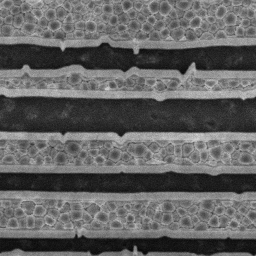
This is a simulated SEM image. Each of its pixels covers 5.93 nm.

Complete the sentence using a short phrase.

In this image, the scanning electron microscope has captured one or a few lines or trenches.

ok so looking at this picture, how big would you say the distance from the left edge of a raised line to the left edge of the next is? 389 nm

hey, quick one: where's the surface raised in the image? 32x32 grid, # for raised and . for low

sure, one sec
################################
################################
################################
################################
################################
.......#........##....#.........
................................
................................
................................
######################.#########
################################
.....###########################
................................
................................
................................
................................
................................
################################
################################
################################
################################
................................
................................
................................
................................
################################
################################
################################
################################
................................
................................
................................